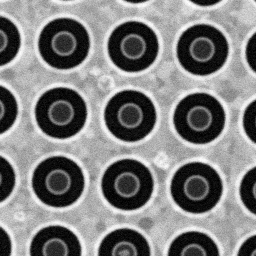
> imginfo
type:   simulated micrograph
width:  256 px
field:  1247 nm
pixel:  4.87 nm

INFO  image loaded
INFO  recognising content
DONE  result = an array of small figures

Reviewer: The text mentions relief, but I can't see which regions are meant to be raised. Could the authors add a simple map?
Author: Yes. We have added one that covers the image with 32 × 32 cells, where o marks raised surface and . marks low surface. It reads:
oooooooooooooooo..oooooo...ooooo
oooooooooooooooooooooooooooooooo
..oooo....oooooo.ooooooooooooooo
..ooo......ooo.....oooo....ooooo
o..oo..oo..oo...o...oo......ooo.
o..oo..oo...o..ooo..oo..oo...oo.
..ooo..oo..oo..ooo..oo..ooo..o..
..ooo......ooo......oo...o...oo.
oooooo....oooo.....oooo.....ooo.
oooooooooooooooooooooooo..oooooo
oooooooooooooooooooooooooooooooo
..ooo.....oooo....oooooo..oooooo
..oo.......oo......ooo.....oooo.
..oo..ooo..oo..oo...oo..o...ooo.
..oo..ooo..oo..ooo..o...oo..oo..
..oo...o...oo..oo...oo..oo..oo..
.oooo.....oooo.....ooo......oo..
ooooooo.ooooooo...ooooo....oooo.
oooooooooooooooooooooooooooooooo
.ooooo..oooooooooooooooooooooooo
..ooo.....oooo....ooooo...oooooo
..oo...o..ooo......ooo.....oooo.
..oo..ooo..o...oo..oo..ooo..oo..
..oo..oo...oo..oo..oo..ooo..oo..
.ooo......ooo......oo...oo..oo..
ooooo....ooooo.....ooo.....ooo..
ooooooooooooooooooooooo...ooooo.
oooooooooooooooooooooooooooooooo
.oooo....ooooo...ooooooooooooooo
.ooo......ooo.....oooo....ooooo.
..oo..oo..oo...o...oo......ooo..
..oo..oo..oo..ooo..oo..oo...oo..